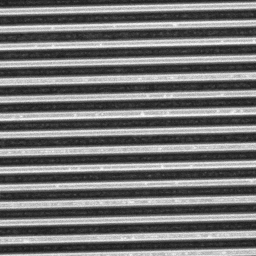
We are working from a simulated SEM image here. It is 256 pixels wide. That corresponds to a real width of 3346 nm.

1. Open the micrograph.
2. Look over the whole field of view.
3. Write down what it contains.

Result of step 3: parallel lines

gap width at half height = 142 nm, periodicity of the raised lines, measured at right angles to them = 230 nanometers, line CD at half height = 91.4 nm